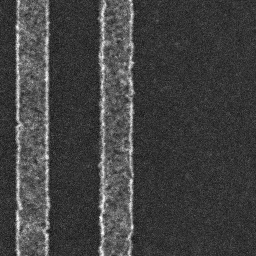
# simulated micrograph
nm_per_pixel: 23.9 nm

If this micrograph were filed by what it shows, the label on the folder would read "one or a few lines or trenches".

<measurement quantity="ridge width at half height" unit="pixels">28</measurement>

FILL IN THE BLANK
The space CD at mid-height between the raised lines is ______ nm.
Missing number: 1330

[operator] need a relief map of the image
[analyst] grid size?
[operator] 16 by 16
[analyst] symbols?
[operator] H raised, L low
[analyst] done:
LHHLLLHHLLLLLLLL
LHHLLLHHLLLLLLLL
LHHLLLHHLLLLLLLL
LHHLLLHHLLLLLLLL
LHHLLLHHLLLLLLLL
LHHLLLHHLLLLLLLL
LHHLLLHHLLLLLLLL
LHHLLLHHLLLLLLLL
LHHLLLHHLLLLLLLL
LHHLLLHHLLLLLLLL
LHHLLLHHLLLLLLLL
LHHLLLHHLLLLLLLL
LHHLLLHHLLLLLLLL
LHHLLLHHLLLLLLLL
LHHLLLHHLLLLLLLL
LHHLLLHHLLLLLLLL